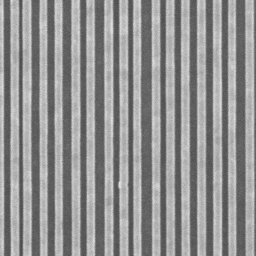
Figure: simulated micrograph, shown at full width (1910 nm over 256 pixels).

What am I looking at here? parallel lines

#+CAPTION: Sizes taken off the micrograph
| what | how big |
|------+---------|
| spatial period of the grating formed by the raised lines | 117 nm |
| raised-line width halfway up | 58.8 nanometres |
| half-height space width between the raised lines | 58.8 nm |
